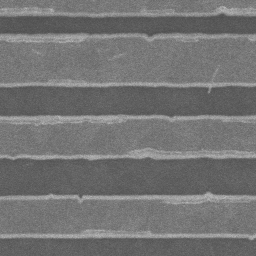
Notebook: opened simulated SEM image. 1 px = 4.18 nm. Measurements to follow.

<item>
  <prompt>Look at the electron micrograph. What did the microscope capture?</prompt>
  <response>one or a few lines or trenches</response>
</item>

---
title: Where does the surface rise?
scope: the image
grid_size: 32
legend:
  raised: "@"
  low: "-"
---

@@@@@@@@@@@@@@@@@@@@@@@@@@@@@@@@
@@@@@@@@@@@@@@@@@@@@@@@@@@@@@@@@
--------------------------------
--------------------------------
@@@@@@@@@@@@@@@@@@-@@@@@@@-@@-@@
@@@@@@@@@@@@@@@@@@@@@@@@@@@@@@@@
@@@@@@@@@@@@@@@@@@@@@@@@@@@@@@@@
@@@@@@@@@@@@@@@@@@@@@@@@@@@@@@@@
@@@@@@@@@@@@@@@@@@@@@@@@@@@@@@@@
@@@@@@@@@@@@@@@@@@@@@@@@@@@@@@@@
@@@@---@@@@@@@@---@@@@@@@@@@@@@@
--------------------------------
--------------------------------
--------------------------------
--------------------------------
@@@@@@@@@@@@@@@@@@@@@@@@@@@@@@@@
@@@@@@@@@@@@@@@@@@@@@@@@@@@@@@@@
@@@@@@@@@@@@@@@@@@@@@@@@@@@@@@@@
@@@@@@@@@@@@@@@@@@@@@@@@@@@@@@@@
@@@@@@@@@@@@@@@@@@-@@@@@@-@@@@@@
--------------------------------
--------------------------------
--------------------------------
--------------------------------
-------------------------@@-----
@@@@@@@@@@@@@@@@@@@@@@@@@@@@@@@@
@@@@@@@@@@@@@@@@@@@@@@@@@@@@@@@@
@@@@@@@@@@@@@@@@@@@@@@@@@@@@@@@@
@@@@@@@@@@@@@@@@@@@@@@@@@@@@@@@@
@@@@@@-------------------------@
--------------------------------
--------------------------------